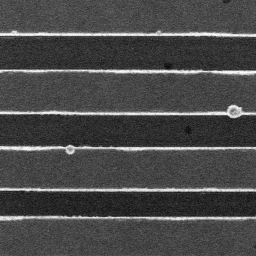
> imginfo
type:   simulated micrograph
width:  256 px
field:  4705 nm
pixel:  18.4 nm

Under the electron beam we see lines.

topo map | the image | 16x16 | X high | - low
XXXXXXXXXXXXXXXX
XXXXXXXXXXXXXXXX
----------------
----------------
XXXXXXXXXXXXXX--
XXXXXXXXXXXXXXXX
XXXXXXXXXXXXXXXX
----------------
----------------
XXXXXXXXXXXXXXXX
XXXXXXXXXXXXXXXX
XXXXXXXXXXXXXXXX
----------------
----------------
XXXXXXXXXXXXXXXX
XXXXXXXXXXXXXXXX